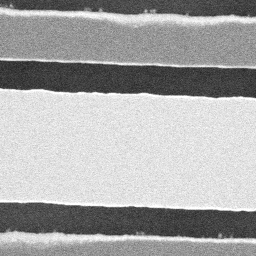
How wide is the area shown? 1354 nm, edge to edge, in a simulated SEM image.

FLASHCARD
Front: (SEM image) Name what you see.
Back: lines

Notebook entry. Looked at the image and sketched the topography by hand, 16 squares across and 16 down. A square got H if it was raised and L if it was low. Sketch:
LLLLLLLLLLLLLLLL
HHHHHHHHHHHHHHHH
HHHHHHHHHHHHHHHH
HHHHHHHHHHHHHHHH
LLLLLLLLLLLLLLLL
LLLLLLLLLLLLLLLL
HHHHHHHHHHHHHHHH
HHHHHHHHHHHHHHHH
HHHHHHHHHHHHHHHH
HHHHHHHHHHHHHHHH
HHHHHHHHHHHHHHHH
HHHHHHHHHHHHHHHH
HHHHHHHHHHHHHHHH
LLLLLLLLLLLLLLLL
LLLLLLLLLLLLLLLL
HHHHHHHHHHHHHHHH